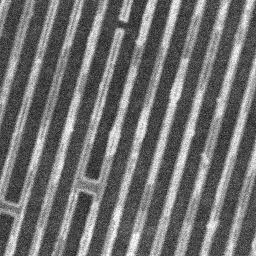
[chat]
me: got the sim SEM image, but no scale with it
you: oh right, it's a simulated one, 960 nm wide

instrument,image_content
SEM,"parallel lines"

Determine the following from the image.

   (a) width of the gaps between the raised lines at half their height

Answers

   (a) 0.0604 micrometres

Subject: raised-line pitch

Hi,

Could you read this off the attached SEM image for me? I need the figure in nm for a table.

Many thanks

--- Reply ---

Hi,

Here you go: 88.2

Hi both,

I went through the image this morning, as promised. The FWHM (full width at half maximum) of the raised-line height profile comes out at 28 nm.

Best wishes